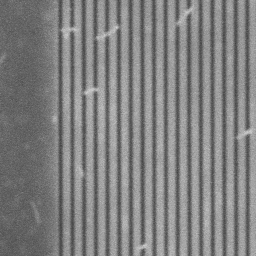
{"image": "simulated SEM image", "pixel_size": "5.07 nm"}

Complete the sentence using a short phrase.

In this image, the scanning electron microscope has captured parallel lines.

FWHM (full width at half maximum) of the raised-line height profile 36.8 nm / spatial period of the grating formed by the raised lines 59.2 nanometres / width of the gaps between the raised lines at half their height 0.0235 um